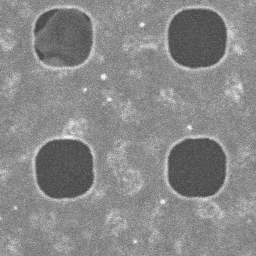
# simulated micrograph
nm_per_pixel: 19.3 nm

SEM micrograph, holes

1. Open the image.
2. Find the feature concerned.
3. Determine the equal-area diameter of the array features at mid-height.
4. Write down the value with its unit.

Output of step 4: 62.4 px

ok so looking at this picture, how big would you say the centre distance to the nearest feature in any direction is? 2520 nm